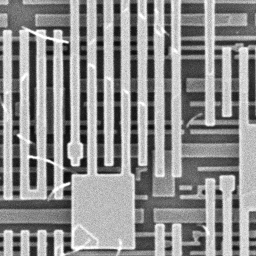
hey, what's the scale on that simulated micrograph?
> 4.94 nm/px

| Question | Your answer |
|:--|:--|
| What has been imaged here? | wiring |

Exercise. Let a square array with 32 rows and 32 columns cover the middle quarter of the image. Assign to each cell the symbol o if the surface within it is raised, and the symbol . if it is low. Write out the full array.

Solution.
..oo..oo..oo..oo...oo..oo..oo...
..oo..oo..oo..oo...oo..oo..oo...
..oo..oo..oo..oo...oo..oo..oo...
..oo..oo..oo..oo...oo..oo..oo...
..oo..oo..oo..ooo..oo..oo..oo...
..oo..oo..oo..ooo..oo..oo..oo...
..oo..oo..oo..ooo..oo..oo..oo...
..oo..oo..oo..ooo..oo..oo..oo...
..oo..oo..oo..ooo..oo..oo..oo...
..oo..oo..oo..ooo..oo..oo..oo...
..oo..oo..oo..ooo..oo..oo..oo...
..oo..oo..oo..ooo..oo..oo..oo...
..oo..oo..oo..ooo..oo..oo..oo...
..oo..oo..oo..ooo..oo..oo..oo...
..oo..oo..oo..ooo..oo..oo..oo...
..oo..oo..oo..ooo..oo..oo..oo...
..oo..oo..oo..ooo..oo..oo..oo...
..oo..oo..oo..ooo..oo..oo..oo...
..oo..oo..oo...o...oo..oo..oo...
..oo..oo..oo...o...oo..oo..oo...
.oooo.oo..oo...o...oo..oo..oo...
.oooo.oo..oo...o...oo..oo..oo...
.oooo.oo..oo...o...oo..oo..oo...
.oooo.oo..oo...oo..oo..oo..oo...
..oo..oo..oo...oo..oo..oo..oo...
......oo.......oo......oo..oo...
......oo.......oo......oo..oo...
......ooo.....ooo......oo..oo...
..ooooooooooooooo...............
..ooooooooooooooo...............
o.oooooooooooooooo..............
..oooooooooooooooo..............